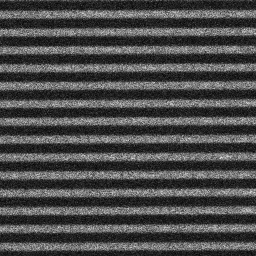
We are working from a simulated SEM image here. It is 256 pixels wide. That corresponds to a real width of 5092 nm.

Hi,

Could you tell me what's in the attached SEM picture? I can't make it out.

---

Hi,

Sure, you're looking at parallel lines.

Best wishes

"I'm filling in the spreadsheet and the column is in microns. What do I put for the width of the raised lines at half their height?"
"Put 0.167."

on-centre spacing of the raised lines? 355 nm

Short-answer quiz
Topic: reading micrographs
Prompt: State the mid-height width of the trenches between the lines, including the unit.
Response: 0.181 um